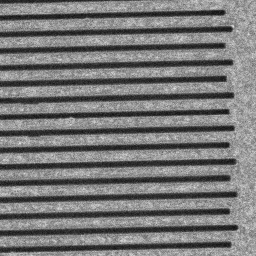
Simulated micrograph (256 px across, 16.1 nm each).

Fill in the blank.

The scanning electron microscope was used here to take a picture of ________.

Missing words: parallel lines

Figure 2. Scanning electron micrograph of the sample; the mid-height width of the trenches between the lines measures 96.8 nm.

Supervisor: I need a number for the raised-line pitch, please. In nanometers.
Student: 268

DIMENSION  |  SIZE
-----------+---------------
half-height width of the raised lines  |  10.9 px